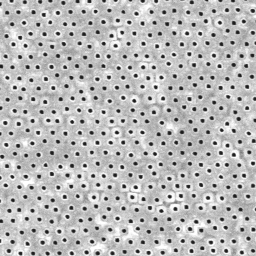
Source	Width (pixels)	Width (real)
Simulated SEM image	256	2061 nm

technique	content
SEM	a regular array of holes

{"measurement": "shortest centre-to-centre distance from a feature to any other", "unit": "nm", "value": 87.1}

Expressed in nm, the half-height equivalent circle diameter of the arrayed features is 36.3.